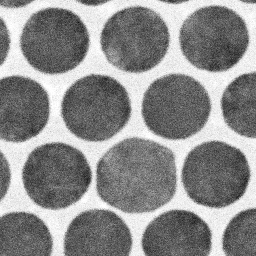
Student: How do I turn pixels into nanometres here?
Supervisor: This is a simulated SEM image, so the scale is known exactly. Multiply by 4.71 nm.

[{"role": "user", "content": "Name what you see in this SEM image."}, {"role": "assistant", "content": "a regular array of holes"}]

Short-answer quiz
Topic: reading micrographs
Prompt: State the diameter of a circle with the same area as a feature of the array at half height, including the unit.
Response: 323 nanometres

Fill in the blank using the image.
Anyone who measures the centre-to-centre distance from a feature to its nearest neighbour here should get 78.4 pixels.